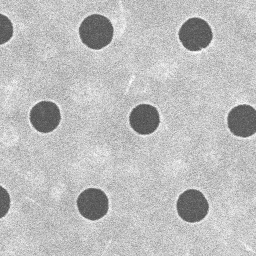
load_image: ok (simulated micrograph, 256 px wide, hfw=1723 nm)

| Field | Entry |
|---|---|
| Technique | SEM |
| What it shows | holes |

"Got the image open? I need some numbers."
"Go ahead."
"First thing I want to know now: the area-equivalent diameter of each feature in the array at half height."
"222 nm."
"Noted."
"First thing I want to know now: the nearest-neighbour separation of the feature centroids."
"668 nm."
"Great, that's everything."